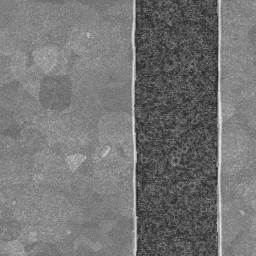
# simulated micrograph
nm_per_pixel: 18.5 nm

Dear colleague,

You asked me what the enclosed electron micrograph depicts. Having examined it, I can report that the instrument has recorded one or a few lines or trenches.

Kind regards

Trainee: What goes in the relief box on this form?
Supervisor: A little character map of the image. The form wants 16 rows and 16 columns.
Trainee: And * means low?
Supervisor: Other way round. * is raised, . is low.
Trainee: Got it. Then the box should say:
********......**
********......**
********......**
********......**
********......**
********......**
********......**
********......**
********......**
********......**
********......**
********......**
********......**
********......**
********......**
********......**